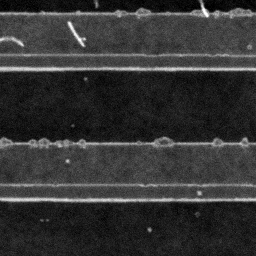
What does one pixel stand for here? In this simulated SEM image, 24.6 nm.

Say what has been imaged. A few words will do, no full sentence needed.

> lines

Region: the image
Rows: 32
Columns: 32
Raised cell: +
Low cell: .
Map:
................................
..............++.++.....++.+.++.
++++++++++++++++++++++++++++++++
++++++++++++++++++++++++++++++++
++++++++++++++++++++++++++++++++
++++++++++++++++++++++++++++++++
++++++++++++++++++++++++++++++++
++++++++++++++++++++++++++++++++
++++++++++++++++++++++++++++++++
................................
................................
................................
................................
................................
................................
................................
................................
+....+..............+.........+.
++++++++++++++++++++++++++++++++
++++++++++++++++++++++++++++++++
++++++++++++++++++++++++++++++++
++++++++++++++++++++++++++++++++
++++++++++++++++++++++++++++++++
++++++++++++++++++++++++++++++++
++++++++++++++++++++++++++++++++
................................
................................
................................
................................
................................
................................
................................